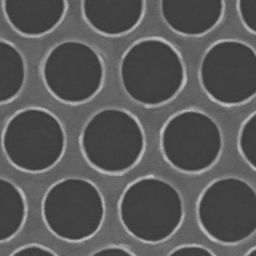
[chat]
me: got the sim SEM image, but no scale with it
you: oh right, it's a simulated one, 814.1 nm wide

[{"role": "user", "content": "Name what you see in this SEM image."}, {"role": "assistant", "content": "holes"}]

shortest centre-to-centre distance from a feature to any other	250	nm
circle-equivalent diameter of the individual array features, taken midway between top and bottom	190	nanometres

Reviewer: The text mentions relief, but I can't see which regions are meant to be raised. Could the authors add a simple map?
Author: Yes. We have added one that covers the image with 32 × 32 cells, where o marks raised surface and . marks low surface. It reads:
o.......ooo.......oo........oo..
o.......ooo.......oo........oo..
o......oooo......oooo......ooo..
oo....oooooo....oooooo....ooooo.
oooooooooooooooooooooooooooooooo
.ooooooo..ooooooo....oooooo...oo
..oooo......oooo......oooo......
...ooo......ooo.......ooo.......
...ooo.......oo........oo.......
...ooo.......oo........oo.......
...ooo.......oo........oo.......
..ooooo.....oooo......oooo......
.ooooooo..ooooooo....oooooo....o
oooooooooooooooooooooooooooooooo
oo....oooooo....oooooo....oooooo
o......oooo......oooo......oooo.
o.......oo........ooo......ooo..
........oo........oo........oo..
o.......oo........oo........oo..
o......oooo......oooo......oooo.
oo.....ooooo.....ooooo....ooooo.
oooooooooooooooooooooooooooooooo
oooooooo..oooooooo..oooooooo..oo
..ooooo.....oooo......oooo.....o
...ooo......oooo......ooo.......
...ooo.......oo........oo.......
...ooo.......oo........oo.......
...ooo.......oo.......ooo.......
..oooo......oooo......oooo......
.ooooooo...oooooo....oooooo....o
oooooooooooooooooooooooooooooooo
oo....oooooo....oooooo....ooooo.